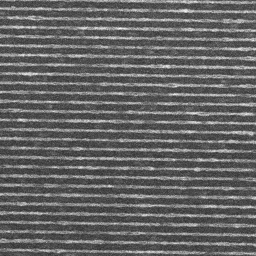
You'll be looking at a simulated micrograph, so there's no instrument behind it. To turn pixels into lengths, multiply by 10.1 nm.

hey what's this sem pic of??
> parallel lines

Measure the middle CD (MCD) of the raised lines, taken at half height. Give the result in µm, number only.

0.0214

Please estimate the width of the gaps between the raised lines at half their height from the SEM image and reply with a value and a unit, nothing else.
72.9 nanometres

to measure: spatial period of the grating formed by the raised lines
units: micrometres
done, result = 0.0934